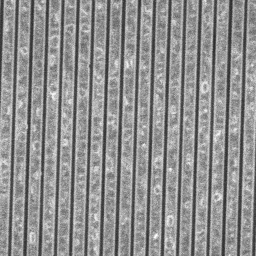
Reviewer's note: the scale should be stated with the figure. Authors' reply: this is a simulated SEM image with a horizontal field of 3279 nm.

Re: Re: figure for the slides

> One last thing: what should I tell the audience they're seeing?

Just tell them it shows parallel lines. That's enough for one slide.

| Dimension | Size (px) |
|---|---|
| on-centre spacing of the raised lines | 15.2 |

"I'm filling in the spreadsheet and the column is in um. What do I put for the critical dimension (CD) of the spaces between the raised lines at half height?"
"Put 0.0464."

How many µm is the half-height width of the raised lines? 0.141